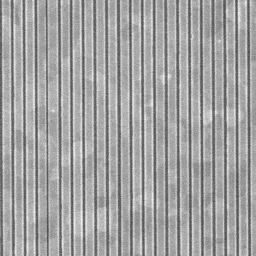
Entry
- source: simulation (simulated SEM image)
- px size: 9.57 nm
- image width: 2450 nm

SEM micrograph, parallel lines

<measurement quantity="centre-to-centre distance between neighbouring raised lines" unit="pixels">11.8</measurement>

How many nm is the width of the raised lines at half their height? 70.6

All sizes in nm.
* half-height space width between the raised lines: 35.9